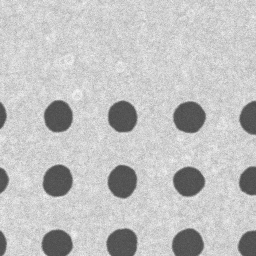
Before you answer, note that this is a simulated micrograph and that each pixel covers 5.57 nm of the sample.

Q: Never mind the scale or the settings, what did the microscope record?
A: holes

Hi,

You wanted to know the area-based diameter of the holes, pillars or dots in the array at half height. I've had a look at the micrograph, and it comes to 173 nm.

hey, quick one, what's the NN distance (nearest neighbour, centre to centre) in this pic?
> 0.358 µm